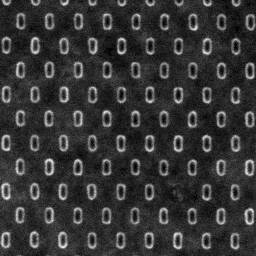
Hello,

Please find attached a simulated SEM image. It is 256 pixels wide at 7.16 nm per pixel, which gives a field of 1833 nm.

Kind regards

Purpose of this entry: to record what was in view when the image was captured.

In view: a regular array of raised bodies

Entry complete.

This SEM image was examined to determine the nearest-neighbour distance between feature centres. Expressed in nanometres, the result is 200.